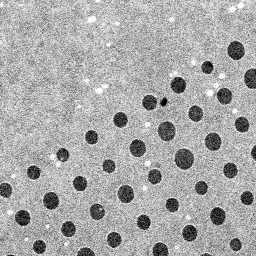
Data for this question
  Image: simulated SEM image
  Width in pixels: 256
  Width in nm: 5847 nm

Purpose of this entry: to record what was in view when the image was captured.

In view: a regular array of raised bodies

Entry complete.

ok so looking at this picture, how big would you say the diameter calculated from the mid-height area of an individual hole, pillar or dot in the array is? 0.374 micrometres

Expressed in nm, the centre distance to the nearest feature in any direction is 756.